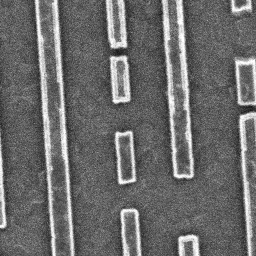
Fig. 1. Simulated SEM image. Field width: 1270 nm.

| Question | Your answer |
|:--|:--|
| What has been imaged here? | one or a few lines or trenches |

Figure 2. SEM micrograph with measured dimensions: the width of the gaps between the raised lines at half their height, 0.255 microns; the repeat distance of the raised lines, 0.318 micrometres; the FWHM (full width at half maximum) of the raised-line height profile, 86.7 nm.